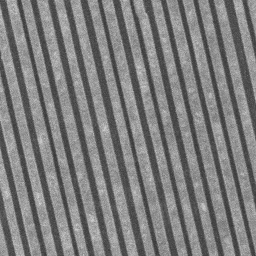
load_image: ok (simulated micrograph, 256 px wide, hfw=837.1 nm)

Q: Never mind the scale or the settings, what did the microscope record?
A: parallel lines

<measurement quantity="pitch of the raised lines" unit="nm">51.3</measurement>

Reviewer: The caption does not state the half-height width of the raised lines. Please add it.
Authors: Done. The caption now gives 29.5 nm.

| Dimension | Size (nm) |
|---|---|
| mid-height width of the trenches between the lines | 20.8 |